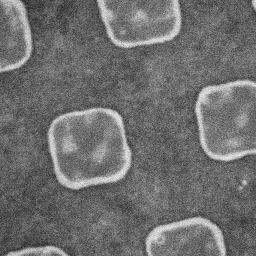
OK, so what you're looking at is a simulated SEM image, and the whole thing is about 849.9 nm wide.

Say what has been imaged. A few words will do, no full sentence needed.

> raised bodies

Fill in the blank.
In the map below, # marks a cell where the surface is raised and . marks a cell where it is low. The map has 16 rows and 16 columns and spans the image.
#.....#####.....
##.....####.....
##.....###......
##..............
................
.............###
............####
....###.....####
...#####.....###
...#####.....###
....####........
....#...........
................
................
..........####..
.........#####..